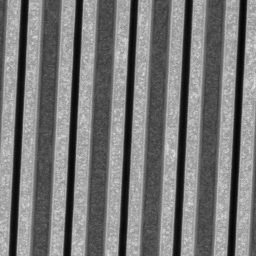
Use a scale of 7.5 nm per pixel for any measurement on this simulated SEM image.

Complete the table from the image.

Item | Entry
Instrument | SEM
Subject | parallel lines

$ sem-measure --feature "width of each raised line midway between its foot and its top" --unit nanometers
112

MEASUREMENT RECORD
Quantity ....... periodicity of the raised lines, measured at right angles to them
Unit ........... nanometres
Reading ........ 204